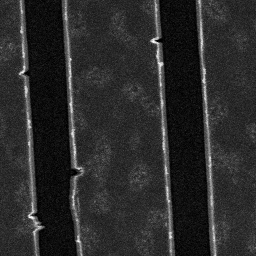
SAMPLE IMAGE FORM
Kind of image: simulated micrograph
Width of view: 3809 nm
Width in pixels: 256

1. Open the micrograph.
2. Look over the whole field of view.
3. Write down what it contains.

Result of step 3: one or a few lines or trenches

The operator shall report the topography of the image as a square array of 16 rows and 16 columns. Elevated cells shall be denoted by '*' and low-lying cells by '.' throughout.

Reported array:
*...******..****
*...******..****
**..******..****
**..******...***
**..******...***
**..******...***
**..******...***
**..******...***
**..******...***
**...*****...***
**...*****...***
**...*****...***
**..*******..***
**...******..***
**...******..***
**...******..***